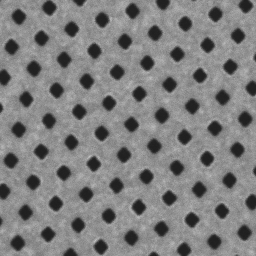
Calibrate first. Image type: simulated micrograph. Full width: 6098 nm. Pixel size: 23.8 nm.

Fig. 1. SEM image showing a regular array of holes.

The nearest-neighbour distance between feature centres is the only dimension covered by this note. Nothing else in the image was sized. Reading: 743 nm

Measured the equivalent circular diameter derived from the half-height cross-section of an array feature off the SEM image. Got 15.1 px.